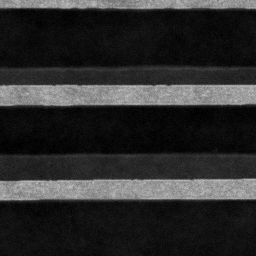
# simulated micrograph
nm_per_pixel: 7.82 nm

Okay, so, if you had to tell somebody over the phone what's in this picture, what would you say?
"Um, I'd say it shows lines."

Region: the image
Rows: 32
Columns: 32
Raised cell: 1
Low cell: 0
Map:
11111111111111111111111111111111
00000000000000000000000000000000
00000000000000000000000000000000
00000000000000000000000000000000
00000000000000000000000000000000
00000000000000000000000000000000
00000000000000000000000000000000
00000000000000000000000000000000
00000000000000000000000000000000
11111111111111111111111111111111
11111111111111111111111111111111
11111111111111111111111111111111
11111111111111111111111111111111
00000000000000000000000000000000
00000000000000000000000000000000
00000000000000000000000000000000
00000000000000000000000000000000
00000000000000000000000000000000
00000000000000000000000000000000
00000000111111111111111111111110
11111111111111111111111111111111
11111111111111111111111111111111
11111111111111111111111111111111
11111111111111111111111111111111
11111111111111111111111111111111
00000000000000000000000000000000
00000000000000000000000000000000
00000000000000000000000000000000
00000000000000000000000000000000
00000000000000000000000000000000
00000000000000000000000000000000
00000000000000000000000000000000